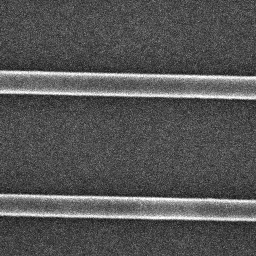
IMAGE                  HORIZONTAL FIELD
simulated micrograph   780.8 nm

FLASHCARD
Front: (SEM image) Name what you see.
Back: one or a few lines or trenches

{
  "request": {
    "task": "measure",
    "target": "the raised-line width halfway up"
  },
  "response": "62.7 nanometers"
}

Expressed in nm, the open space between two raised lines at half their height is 312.